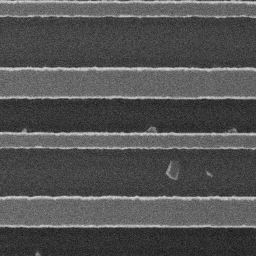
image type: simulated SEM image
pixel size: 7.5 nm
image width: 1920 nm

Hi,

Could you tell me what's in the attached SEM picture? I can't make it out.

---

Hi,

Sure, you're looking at lines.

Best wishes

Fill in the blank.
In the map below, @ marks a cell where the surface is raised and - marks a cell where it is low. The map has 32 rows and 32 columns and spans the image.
@@@@@@@@@@@@@@@@@@@@@@@@@@@@@@@@
@@@@@@@@@@@@@@@@@@@@@@@@@@@@@@@@
--------------------------------
--------------------------------
--------------------------------
--------------------------------
--------------------------------
--------------------------------
-----------@--------------------
@@@@@@@@@@@@@@@@@@@@@@@@@@@@@@@@
@@@@@@@@@@@@@@@@@@@@@@@@@@@@@@@@
@@@@@@@@@@@@@@@@@@@@@@@@@@@@@@@@
--------------------------------
--------------------------------
--------------------------------
--------------------------------
--------------------------------
@@@@@@@@@@@@@@@@@@@@@@@@@@@@@@@@
-@-@--@@@@@@@@@@@@@@@@@@@@@@@@@@
--------------------------------
--------------------------------
--------------------------------
--------------------------------
--------------------------------
--------------------------------
@@@@@@@@@@@@@@@@@@@@@@@@@@@@@@@@
@@@@@@@@@@@@@@@@@@@@@@@@@@@@@@@@
@@@@@@@@@@@@@@@@@@@@@@@@@@@@@@@@
--------------------------------
--------------------------------
--------------------------------
--------------------------------